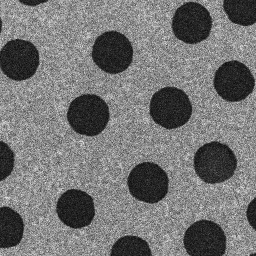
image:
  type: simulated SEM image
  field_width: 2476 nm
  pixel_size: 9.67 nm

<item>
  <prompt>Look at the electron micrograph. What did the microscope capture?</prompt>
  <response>a regular array of holes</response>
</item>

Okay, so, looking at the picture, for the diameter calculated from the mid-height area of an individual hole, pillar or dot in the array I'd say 0.407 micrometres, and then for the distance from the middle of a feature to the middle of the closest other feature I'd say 68.9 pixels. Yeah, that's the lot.